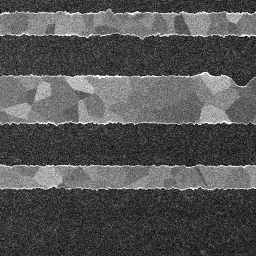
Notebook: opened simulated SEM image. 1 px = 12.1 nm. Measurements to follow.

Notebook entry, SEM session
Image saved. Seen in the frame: one or a few lines or trenches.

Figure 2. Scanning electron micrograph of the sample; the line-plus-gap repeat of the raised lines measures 928 nanometres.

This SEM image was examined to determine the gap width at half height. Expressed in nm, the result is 503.